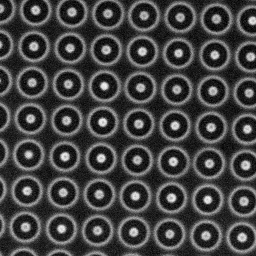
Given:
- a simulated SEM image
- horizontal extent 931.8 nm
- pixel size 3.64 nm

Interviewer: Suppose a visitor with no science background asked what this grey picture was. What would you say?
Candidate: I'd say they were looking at an array of small figures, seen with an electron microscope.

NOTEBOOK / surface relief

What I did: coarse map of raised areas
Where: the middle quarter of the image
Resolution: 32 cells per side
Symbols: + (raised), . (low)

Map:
++++++++++++++++++++++++++++.+++
++++++++++++++++++++++++++++++++
...+++++...++++++++.++++++++++++
....+++......++++....++++++...++
++..+++......+++......+++......+
++..+++..++...++..++..+++......+
....+++......+++..++..+++..++..+
...++++......+++......+++......+
++++++++....+++++....+++++.....+
+++++++++++++++++++++++++++...++
++++++++++++++++++++++++++++++++
...++++++..+++++++++++++++++++++
....+++.....+++++....+++++...+++
+...++.......+++......+++.....++
+...++...++..+++..+...+++......+
....+++......++...+...++...++..+
...++++.....++++......+++......+
.+++++++...++++++....++++.....++
+++++++++++++++++++++++++++..+++
++++++++++++++++++++++++++++++++
..++++++..++++++++++++++++++++++
...++++.....++++....++++++...+++
+..+++......+++......++++.....++
+...++..++...++...+...++.......+
...+++......+++...+...++..++...+
..+++++.....+++......+++.......+
++++++++...+++++.....++++.....++
++++++++++++++++++.+++++++...+++
++++++++++++++++++++++++++++++++
..++++++..++++++++++++++++++++++
...+++.....+++++....+++++...++++
...+++......+++......+++.....+++